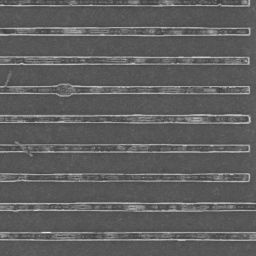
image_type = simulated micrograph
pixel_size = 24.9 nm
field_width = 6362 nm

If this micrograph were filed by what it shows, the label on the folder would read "parallel lines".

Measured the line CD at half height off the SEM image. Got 183 nm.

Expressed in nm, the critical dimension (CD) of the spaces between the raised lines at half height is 553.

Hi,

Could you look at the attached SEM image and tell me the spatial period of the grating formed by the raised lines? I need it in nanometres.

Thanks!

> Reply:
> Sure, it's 727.